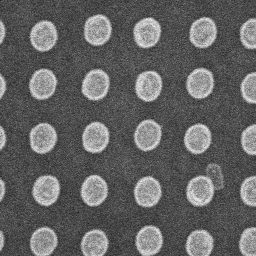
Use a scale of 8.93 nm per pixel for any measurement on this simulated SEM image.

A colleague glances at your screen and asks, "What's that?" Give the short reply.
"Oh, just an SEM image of a regular array of raised bodies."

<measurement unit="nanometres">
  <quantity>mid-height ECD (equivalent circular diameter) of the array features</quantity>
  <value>245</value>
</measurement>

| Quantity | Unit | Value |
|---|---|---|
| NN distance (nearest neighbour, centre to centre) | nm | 444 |